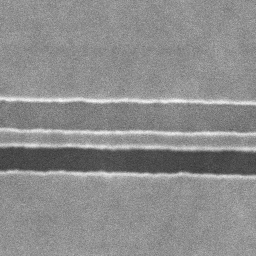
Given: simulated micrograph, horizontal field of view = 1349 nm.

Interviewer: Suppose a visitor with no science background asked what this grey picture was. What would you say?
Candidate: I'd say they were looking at lines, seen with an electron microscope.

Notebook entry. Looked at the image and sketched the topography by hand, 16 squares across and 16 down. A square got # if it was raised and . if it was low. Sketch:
################
################
################
################
################
################
################
################
################
................
................
################
################
################
################
################